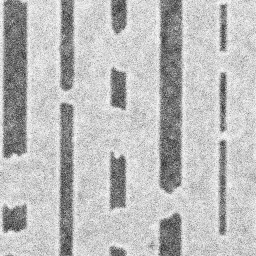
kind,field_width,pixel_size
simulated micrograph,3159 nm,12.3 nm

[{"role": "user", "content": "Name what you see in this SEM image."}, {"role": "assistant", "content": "parallel lines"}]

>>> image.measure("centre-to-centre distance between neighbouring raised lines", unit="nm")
639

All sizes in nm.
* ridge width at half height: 419